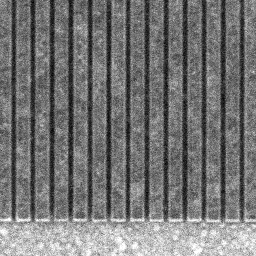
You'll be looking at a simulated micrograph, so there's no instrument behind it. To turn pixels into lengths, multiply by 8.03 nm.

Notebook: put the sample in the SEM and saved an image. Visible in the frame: parallel lines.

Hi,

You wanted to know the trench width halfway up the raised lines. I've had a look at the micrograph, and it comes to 6.25 pixels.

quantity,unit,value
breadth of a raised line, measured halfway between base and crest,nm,106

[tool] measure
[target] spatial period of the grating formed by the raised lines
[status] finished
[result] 153 nanometres